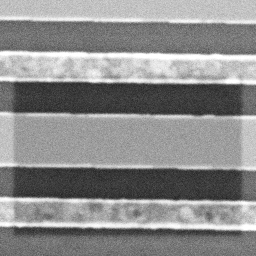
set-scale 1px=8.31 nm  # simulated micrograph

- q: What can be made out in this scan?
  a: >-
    lines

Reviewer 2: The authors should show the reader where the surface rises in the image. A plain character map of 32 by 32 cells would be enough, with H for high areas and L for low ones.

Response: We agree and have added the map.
HHHHHHHHHHHHHHHHHHHHHHHHHHHHHHHH
HHHHHHHHHHHHHHHHHHHHHHHHHHHHHHHH
LLLLLLLLLLLLLHHHHHHHHHHHHHHHHHHH
LLLLLLLLLLLLLLLLLLLLLLLLLLLLLLLL
LLLLLLLLLLLLLLLLLLLLLLLLLLLLLLLL
LLLLLLLLLLLLLLLLLLLLLLLLLLLLLLLL
LLLLLLLLLLLLLLLLLLLLLLLLLLLLLLLL
HHHHHHHHHHHHHHHHHHHHHHHHHHHHHHHH
HHHHHHHHHHHHHHHHHHHHHHHHHHHHHHHH
HHHHHHHHHHHHHHHHHHHHHHHHHHHHHHHH
LLLLLLLLLLLLLLLLLLLLLLLLLLLLLLLL
LLLLLLLLLLLLLLLLLLLLLLLLLLLLLLLL
LLLLLLLLLLLLLLLLLLLLLLLLLLLLLLLL
LLLLLLLLLLLLLLLLLLLLLLLLLLLLLLLL
HHHHHHHHHHHHHHHHHHLLLLLLLLLLLLLL
HHHHHHHHHHHHHHHHHHHHHHHHHHHHHHHH
HHHHHHHHHHHHHHHHHHHHHHHHHHHHHHHH
HHHHHHHHHHHHHHHHHHHHHHHHHHHHHHHH
HHHHHHHHHHHHHHHHHHHHHHHHHHHHHHHH
HHHHHHHHHHHHHHHHHHHHHHHHHHHHHHHH
HHHHHHHHHHHHHHHHHHHHHHHHHHHHHHHH
LLLLLLLLLLLLLLLLLLLLLLLLLLLLLLLL
LLLLLLLLLLLLLLLLLLLLLLLLLLLLLLLL
LLLLLLLLLLLLLLLLLLLLLLLLLLLLLLLL
LLLLLLLLLLLLLLLLLLLLLLLLLLLLLLLL
HHHHHHHHHHHHHHHHHHHHHHHHHHHHHHHH
HHHHHHHHHHHHHHHHHHHHHHHHHHHHHHHH
HHHHHHHHHHHHHHHHHHHHHHHHHHHHHHHH
LLLLLLLLLLLLLLLLLLLLLLHHHHHHHHHH
LLLLLLLLLLLLLLLLLLLLLLLLLLLLLLLL
LLLLLLLLLLLLLLLLLLLLLLLLLLLLLLLL
LLLLLLLLLLLLLLLLLLLLLLLLLLLLLLLL